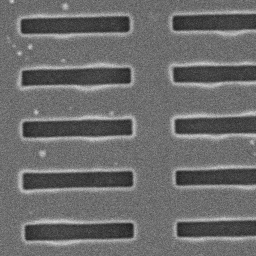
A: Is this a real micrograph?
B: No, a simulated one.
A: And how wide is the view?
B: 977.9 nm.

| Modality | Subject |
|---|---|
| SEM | groups of lines, slits or small figures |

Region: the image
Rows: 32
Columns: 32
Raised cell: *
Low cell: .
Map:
********************************
********************************
***.............*****...........
***.............******..........
********************************
********************************
********************************
********************************
**********......******..........
***.............******..........
***.............*********..*****
********************************
********************************
********************************
******************************..
***..............*****..........
***..............*****..........
********************************
********************************
********************************
********************************
***.**..........******..........
***..............*****..........
***............*****************
********************************
********************************
********************************
****************************.*..
***..............*****..........
***..............*****..........
********************************
********************************